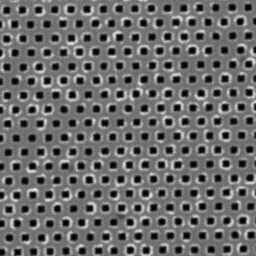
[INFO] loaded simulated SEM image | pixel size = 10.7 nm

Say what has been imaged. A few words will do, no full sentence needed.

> a regular array of holes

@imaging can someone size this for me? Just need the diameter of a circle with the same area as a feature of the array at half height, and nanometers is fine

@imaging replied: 93.9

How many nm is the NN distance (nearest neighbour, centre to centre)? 169